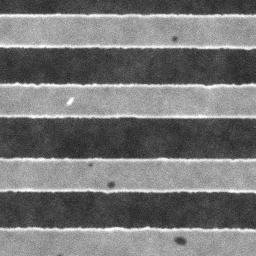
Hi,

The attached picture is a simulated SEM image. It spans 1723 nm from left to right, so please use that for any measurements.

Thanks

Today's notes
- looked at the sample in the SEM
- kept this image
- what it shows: lines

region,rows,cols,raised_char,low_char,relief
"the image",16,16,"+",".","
................
++++++++++++++++
++++++++++++++++
................
................
++++++++++++++++
++++++++++++++++
................
................
................
++++++++++++++++
++++++++++++++++
................
................
++++++++++++++++
++++++++++++++++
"